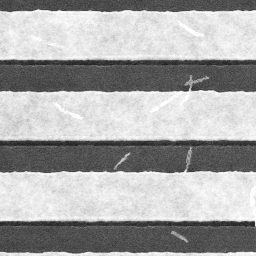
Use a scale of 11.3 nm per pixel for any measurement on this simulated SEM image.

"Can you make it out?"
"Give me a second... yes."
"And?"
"lines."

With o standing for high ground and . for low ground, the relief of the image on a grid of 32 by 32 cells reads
................................
oooooooooooooooooooooooooooooooo
oooooooooooooooooooooooooooooooo
oooooooooooooooooooooooooooooooo
oooooooooooooooooooooooooooooooo
oooooooooooooooooooooooooooooooo
oooooooooooooooooooooooooooooooo
................................
................................
................................
................................
oo.o...oo.ooo...oo.o..ooooo..o..
oooooooooooooooooooooooooooooooo
oooooooooooooooooooooooooooooooo
oooooooooooooooooooooooooooooooo
oooooooooooooooooooooooooooooooo
oooooooooooooooooooooooooooooooo
ooo.ooooooooo.o..o...oo..oo..ooo
................................
................................
................................
...o...ooooo.ooo..o....oooo.oo..
oooooooooooooooooooooooooooooooo
oooooooooooooooooooooooooooooooo
oooooooooooooooooooooooooooooooo
oooooooooooooooooooooooooooooooo
oooooooooooooooooooooooooooooooo
oooooooooooooooooooooooooooooooo
................................
................................
................................
................................